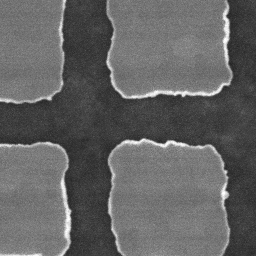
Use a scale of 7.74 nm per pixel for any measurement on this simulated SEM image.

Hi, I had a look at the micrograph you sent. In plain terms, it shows raised bodies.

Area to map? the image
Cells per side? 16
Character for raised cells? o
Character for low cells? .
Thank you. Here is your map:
oooo...ooooooo..
oooo...ooooooo..
oooo...ooooooo..
oooo...ooooooo..
oooo...ooooooo..
oooo...ooooooo..
................
................
................
oooo...ooooooo..
oooo...ooooooo..
oooo...ooooooo..
oooo...ooooooo..
oooo...ooooooo..
oooo...ooooooo..
oooo...ooooooo..